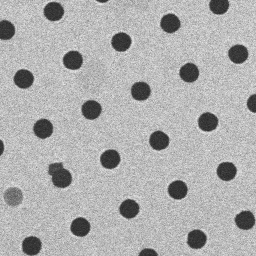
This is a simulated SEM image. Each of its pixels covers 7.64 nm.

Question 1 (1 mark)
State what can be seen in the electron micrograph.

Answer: a regular array of holes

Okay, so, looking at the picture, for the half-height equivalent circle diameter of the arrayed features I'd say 151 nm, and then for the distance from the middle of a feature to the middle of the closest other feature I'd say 0.398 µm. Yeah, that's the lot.